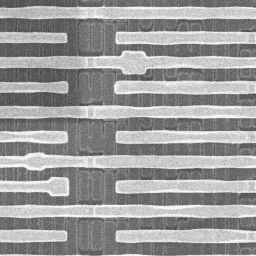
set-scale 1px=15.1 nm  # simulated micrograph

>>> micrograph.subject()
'wiring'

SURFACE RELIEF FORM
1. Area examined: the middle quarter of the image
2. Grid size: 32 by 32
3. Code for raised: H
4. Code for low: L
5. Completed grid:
HHHHHHHHHHHHHHHHHHHHHHHHHHHHHLLH
LLLLLLLLLLLLLLHHHHHHHLLLLLLLLLLL
LLLLLLLLLLLLLLLLLLLLLLLLLLLLLLLL
LLLLLLLLLLLLLLLLLLLLLLLLLLLLLLLL
LLLLLLLLLLLLLHHHHHHHHHHHHLLLLLLH
HLLLLLLLLLLLLHHHHHHHHHHHHHHHHHHH
HLLLLLLLLLLLLHHHHHHHHHHHHHHHHHHH
LLLLLLLLLLLLLLLLLLLLLLLLLLLLLLLH
LLLLLLLLLLLLLLLLLLLLLLLLLLLLLLLL
LLLLLLLLLLLLLLLLLLLLLLLLLLLLLLLL
LLLLLLLLLLLLLLLLLLLLLLLLLLLLLLLL
HHHHHHHHHHHHHHHHHHHHHHHHHHHHHHHH
HHHHHHHHHHHHHHHHHHHHHHHHHHHHHHHH
LLLLLLLLLLLLLLLLLLLLLLLLLLLLLLLL
LLLLLLLLLLLLLLLLLLLLLLLLLLLLLLLL
LLLLLLLLLLLLLLLLLLLLLLLLLLLLLLLL
LLLLLLLLLLLLLLLLLLLLLLLLLLLLLLLL
LLLLLLLLLLLLLHHHHHHHHHHHHHHHHHHH
HLLLLLLLLLLLLHHHHHHHHHHHHHHHHHHH
LLLLLLLLLLLLLHHHHHHHHHHHHHHLLLLL
LLLLLLLLLLLLLLLLLLLLLLLLLLLLLLLL
LLLLLLLLLLLLLLLLLLLLLLLLLLLLLLLL
LLLLLLLLLLLLLLLLLLLLLLLLLLLLLLLL
HHHHHHLHHHHHHHHHHHHHHHHHHHHHHHHH
HHHHHHHHHHHHHHHHHHHHHHHHHHHHHHHH
HLLLLLLLHHHHHHHHHHHHHHHHHHHHHHHH
LLLLLLLLLLLLLLLLLLLLLLLLLLLLLLLL
LLLLLLLLLLLLLLLLLLLLLLLLLLLLLLLL
LLLLLLLLLLLLLLLLLLLLLLLLLLLLLLLL
HLLLLLLLLLLLLHHHHHHHHHHHHHHHHHHH
HLLLLLLLLLLLLHHHHHHHHHHHHHHHHHHH
HLLLLLLLLLLLLHHHHHHHHHHHHHHHHHHH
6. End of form